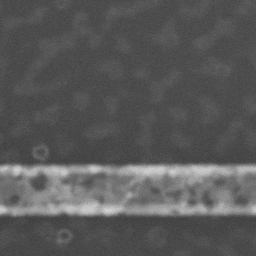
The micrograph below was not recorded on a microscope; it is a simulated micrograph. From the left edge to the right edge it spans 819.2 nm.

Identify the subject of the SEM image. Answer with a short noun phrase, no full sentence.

one or a few lines or trenches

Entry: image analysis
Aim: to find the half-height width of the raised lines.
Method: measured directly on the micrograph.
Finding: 39.6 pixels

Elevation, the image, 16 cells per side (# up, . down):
................
................
................
................
................
................
................
................
................
................
................
################
################
................
................
................